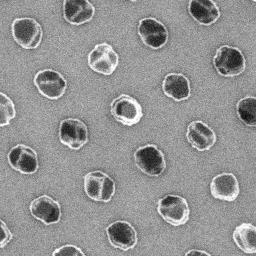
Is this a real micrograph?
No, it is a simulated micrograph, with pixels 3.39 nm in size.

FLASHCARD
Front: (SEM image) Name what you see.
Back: a regular array of raised bodies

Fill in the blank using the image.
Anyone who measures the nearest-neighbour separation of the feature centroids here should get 186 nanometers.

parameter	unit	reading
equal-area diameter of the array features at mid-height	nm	96.1